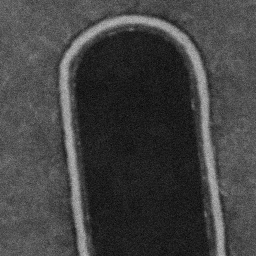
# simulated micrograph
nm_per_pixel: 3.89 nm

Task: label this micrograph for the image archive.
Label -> one or a few lines or trenches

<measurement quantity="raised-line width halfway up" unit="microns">0.53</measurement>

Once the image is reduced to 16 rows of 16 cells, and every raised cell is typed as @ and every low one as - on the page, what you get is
----------------
-------@@@------
-----@@@@@@-----
----@@@@@@@@----
----@@@@@@@@----
----@@@@@@@@@---
----@@@@@@@@@---
----@@@@@@@@@---
----@@@@@@@@@---
----@@@@@@@@@---
-----@@@@@@@@---
-----@@@@@@@@---
-----@@@@@@@@---
-----@@@@@@@@@--
-----@@@@@@@@@--
-----@@@@@@@@@--